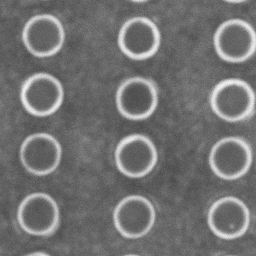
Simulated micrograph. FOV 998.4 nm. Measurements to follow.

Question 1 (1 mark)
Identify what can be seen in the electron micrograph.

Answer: a regular array of raised bodies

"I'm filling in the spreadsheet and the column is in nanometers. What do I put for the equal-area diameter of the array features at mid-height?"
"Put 155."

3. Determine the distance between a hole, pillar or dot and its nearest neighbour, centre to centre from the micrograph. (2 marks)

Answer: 230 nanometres